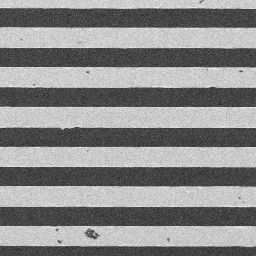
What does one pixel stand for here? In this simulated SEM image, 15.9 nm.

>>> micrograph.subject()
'parallel lines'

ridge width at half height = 321 nm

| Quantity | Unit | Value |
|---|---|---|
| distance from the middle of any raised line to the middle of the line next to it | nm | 627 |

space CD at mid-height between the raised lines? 305 nanometers